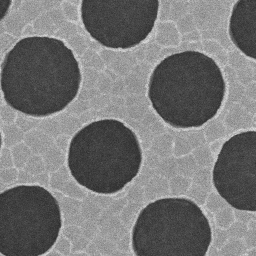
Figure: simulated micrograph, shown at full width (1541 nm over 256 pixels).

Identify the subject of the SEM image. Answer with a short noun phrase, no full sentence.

holes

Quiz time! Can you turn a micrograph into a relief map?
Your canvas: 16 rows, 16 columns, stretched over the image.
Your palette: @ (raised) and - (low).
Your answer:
@@@@@-----@@@@@-
@@@@@-----@@@@--
@---@@---@@@@@@-
-----@@@@@@--@@@
-----@@@@@----@@
-----@@@@-----@@
@---@@@@@@----@@
@@@@@@@@@@---@@@
@@@@@---@@@@@@@-
@@@@-----@@@@@--
@@@@-----@@@@---
@@@@@---@@@@@---
---@@@@@@@--@@--
----@@@@@----@@@
----@@@@-----@@@
---@@@@@-----@@@